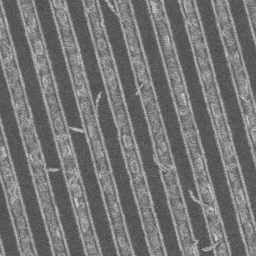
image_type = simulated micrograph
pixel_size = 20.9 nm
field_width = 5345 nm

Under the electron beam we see parallel lines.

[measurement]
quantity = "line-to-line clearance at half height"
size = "290 nanometers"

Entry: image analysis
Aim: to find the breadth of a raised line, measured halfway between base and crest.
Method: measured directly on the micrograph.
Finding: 17.1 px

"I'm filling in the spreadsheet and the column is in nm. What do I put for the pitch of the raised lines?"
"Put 652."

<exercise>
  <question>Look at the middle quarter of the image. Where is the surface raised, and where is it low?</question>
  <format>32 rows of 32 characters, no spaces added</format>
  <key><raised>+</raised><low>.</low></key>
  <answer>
+....++++....++++....++++....+++
+....++++....++++....+++++...+++
++...+++++...+++++...+++++...+++
++...+++++...+++++....++++....++
++....++++....++++....++++....++
++....++++....++++....++++....++
+++...+++++...+++++....++++....+
+++....++++....++++....++++....+
+++....++++....++++....++++....+
+++....++++....++++....+++++...+
++++...+++++...+++++...+++++...+
++++....++++....++++....++++....
++++....++++....++++....+++++...
+++++...+++++...+++++...+++++...
+++++...+++++...+++++....++++...
.++++....++++....++++....++++...
.++++....+++++...++++....++++...
.+++++...+++++...+++++...+++++..
..++++....++++....++++....++++..
..++++....++++.+..++++....++++..
..++++....++++....++++....+++++.
..+++++...+++++...+++++....++++.
..+++++....++++....++++....++++.
...++++....++++....++++....++++.
...+++++...+++++...+++++...+++++
...+++++...+++++.+.+++++....++++
...+++++....++++....+++++...++++
....++++....++++....++++....++++
....++++....+++++...+++++...++++
+...+++++...+++++...+++++....+++
+....++++....++++....++++....+++
+..+.++++....++++....++++....+++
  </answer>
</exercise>